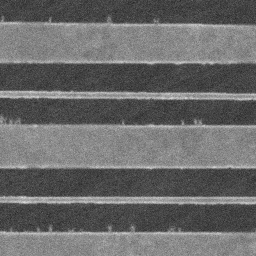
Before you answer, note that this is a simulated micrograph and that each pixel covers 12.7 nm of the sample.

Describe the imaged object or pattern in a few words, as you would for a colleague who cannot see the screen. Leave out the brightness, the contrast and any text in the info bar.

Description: lines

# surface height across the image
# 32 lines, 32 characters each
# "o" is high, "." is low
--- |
................................
................................
................................
oooooooooooooooooooooooooooooooo
oooooooooooooooooooooooooooooooo
oooooooooooooooooooooooooooooooo
oooooooooooooooooooooooooooooooo
oooooooooooooooooooooooooooooooo
................................
................................
................................
ooooo...........................
................................
................................
................................
................................
oooooooooooooooooooooooooooooooo
oooooooooooooooooooooooooooooooo
oooooooooooooooooooooooooooooooo
oooooooooooooooooooooooooooooooo
oooooooooooooooooooooooooooooooo
................................
................................
................................
................................
................................
................................
................................
................................
oooooooooooooooooooooooooooooooo
oooooooooooooooooooooooooooooooo
oooooooooooooooooooooooooooooooo